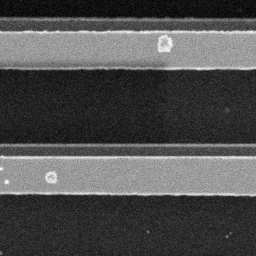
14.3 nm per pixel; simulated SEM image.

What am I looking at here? lines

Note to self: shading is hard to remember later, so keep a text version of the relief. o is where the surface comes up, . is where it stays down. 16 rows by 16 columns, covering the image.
................
oooooooooooooooo
oooooooooooooooo
oooooooooooooooo
................
................
................
................
................
oooooooooooooooo
oooooooooooooooo
oooooooooooooooo
................
................
................
................